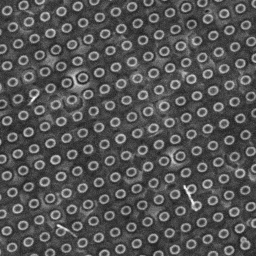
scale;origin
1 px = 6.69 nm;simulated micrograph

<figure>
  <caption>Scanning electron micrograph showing a regular array of raised bodies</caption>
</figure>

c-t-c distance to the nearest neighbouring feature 0.114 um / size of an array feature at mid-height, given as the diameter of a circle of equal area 58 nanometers